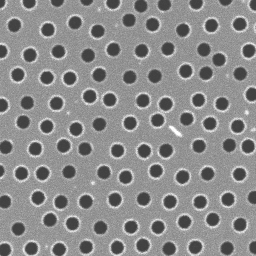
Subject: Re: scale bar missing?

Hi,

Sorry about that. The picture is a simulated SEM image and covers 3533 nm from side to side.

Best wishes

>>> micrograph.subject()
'a regular array of holes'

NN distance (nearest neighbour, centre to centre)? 322 nm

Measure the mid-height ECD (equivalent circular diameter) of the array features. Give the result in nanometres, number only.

193